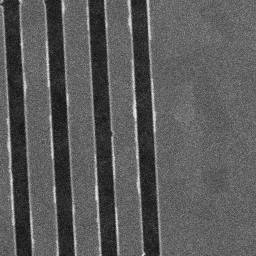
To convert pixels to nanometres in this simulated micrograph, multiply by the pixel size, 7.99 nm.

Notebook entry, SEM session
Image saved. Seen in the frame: parallel lines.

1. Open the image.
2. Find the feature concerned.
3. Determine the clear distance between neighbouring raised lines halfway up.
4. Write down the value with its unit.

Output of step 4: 0.132 um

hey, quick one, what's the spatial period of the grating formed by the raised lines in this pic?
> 0.34 microns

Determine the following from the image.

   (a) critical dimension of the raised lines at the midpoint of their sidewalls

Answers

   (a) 203 nm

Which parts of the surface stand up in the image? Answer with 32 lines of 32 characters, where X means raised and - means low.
---XXX--XXX--XXX--XXXXXXXXXXXXXX
---XXX--XXX--XXX--XXXXXXXXXXXXXX
---XXX--XXX--XXX---XXXXXXXXXXXXX
---XXX--XXX--XXX---XXXXXXXXXXXXX
---XXX--XXX--XXX---XXXXXXXXXXXXX
X--XXX--XXX--XXX---XXXXXXXXXXXXX
X--XXX--XXX--XXXX--XXXXXXXXXXXXX
X--XXX--XXX--XXXX--XXXXXXXXXXXXX
X--XXX--XXX---XXX--XXXXXXXXXXXXX
X--XXX--XXX---XXX--XXXXXXXXXXXXX
X--XXX--XXX---XXX--XXXXXXXXXXXXX
X--XXX--XXX---XXX--XXXXXXXXXXXXX
X--XXX--XXX---XXX--XXXXXXXXXXXXX
X--XXX--XXXX--XXX--XXXXXXXXXXXXX
X--XXX--XXXX--XXX--XXXXXXXXXXXXX
X--XXX---XXX--XXX--XXXXXXXXXXXXX
X--XXX---XXX--XXX--XXXXXXXXXXXXX
X--XXXX--XXX--XXX--XXXXXXXXXXXXX
X--XXXX--XXX--XXX--XXXXXXXXXXXXX
X--XXXX--XXX--XXX--XXXXXXXXXXXXX
X--XXXX--XXX--XXX--XXXXXXXXXXXXX
X---XXX--XXX--XXX---XXXXXXXXXXXX
XX--XXX--XXX--XXX---XXXXXXXXXXXX
X---XXX--XXX--XXX---XXXXXXXXXXXX
XX--XXX--XXX--XXX---XXXXXXXXXXXX
XX--XXX--XXX--XXXX--XXXXXXXXXXXX
XX--XXX--XXX--XXXX--XXXXXXXXXXXX
XX--XXX--XXX---XXX--XX-XXXXXXXXX
XX--XXX--XXX---XXX--XXXXXXXXXXXX
XX--XXX--XXX---XXX--XXXXXXXXXXXX
XX--XXX--XXXX--XXX--XXX-XXXXXXXX
XX--XXX--XXXX--XXX--XX-XXXXXXXXX